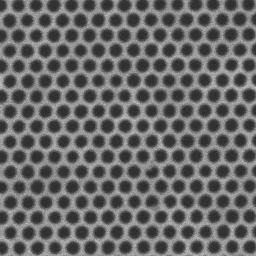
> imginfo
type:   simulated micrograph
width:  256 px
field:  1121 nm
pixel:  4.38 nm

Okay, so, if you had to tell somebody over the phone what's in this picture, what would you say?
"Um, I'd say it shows a regular array of holes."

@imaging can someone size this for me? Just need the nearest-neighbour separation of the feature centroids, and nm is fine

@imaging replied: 75.9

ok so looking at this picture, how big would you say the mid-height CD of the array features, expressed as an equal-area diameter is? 0.0578 µm